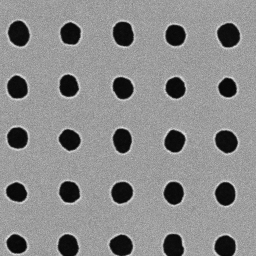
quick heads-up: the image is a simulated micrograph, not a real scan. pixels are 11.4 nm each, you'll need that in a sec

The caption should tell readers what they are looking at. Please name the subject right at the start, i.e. a regular array of holes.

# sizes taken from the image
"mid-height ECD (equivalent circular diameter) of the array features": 247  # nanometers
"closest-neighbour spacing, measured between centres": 588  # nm